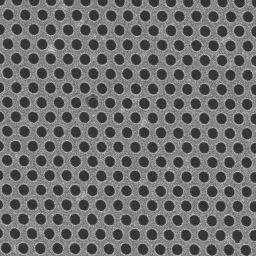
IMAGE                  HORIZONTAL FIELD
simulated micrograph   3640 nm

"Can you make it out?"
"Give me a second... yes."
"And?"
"a regular array of holes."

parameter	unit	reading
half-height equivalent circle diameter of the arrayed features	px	10.5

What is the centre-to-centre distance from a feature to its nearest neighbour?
236 nanometres